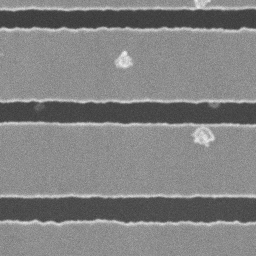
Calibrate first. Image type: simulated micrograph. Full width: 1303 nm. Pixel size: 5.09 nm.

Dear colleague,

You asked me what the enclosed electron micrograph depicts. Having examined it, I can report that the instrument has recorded lines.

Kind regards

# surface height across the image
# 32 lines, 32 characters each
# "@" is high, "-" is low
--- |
@@@@@@@@@@@@@@@@@@@@@@@@@@@@@@@@
--------------------------------
--------------------------------
----@---------@-----@-@@--------
@@@@@@@@@@@@@@@@@@@@@@@@@@@@@@@@
@@@@@@@@@@@@@@@@@@@@@@@@@@@@@@@@
@@@@@@@@@@@@@@@@@@@@@@@@@@@@@@@@
@@@@@@@@@@@@@@@@@@@@@@@@@@@@@@@@
@@@@@@@@@@@@@@@@@@@@@@@@@@@@@@@@
@@@@@@@@@@@@@@@@@@@@@@@@@@@@@@@@
@@@@@@@@@@@@@@@@@@@@@@@@@@@@@@@@
@@@@@@@@@@@@@@@@@@@@@@@@@@@@@@@@
@@@@@@@@@@@@@@@@@@@@@@@@@@@@@@@@
--------------------------------
--------------------------------
@@@@@@@@@@@@@@@-@@@@@--@---@@---
@@@@@@@@@@@@@@@@@@@@@@@@@@@@@@@@
@@@@@@@@@@@@@@@@@@@@@@@@@@@@@@@@
@@@@@@@@@@@@@@@@@@@@@@@@@@@@@@@@
@@@@@@@@@@@@@@@@@@@@@@@@@@@@@@@@
@@@@@@@@@@@@@@@@@@@@@@@@@@@@@@@@
@@@@@@@@@@@@@@@@@@@@@@@@@@@@@@@@
@@@@@@@@@@@@@@@@@@@@@@@@@@@@@@@@
@@@@@@@@@@@@@@@@@@@@@@@@@@@@@@@@
@@@@@@@@@@@@@@@@@@@@@@@@@@@@@@@@
--------------------------------
--------------------------------
------------@-------------------
@@@@@@@@@@@@@@@@@@@@@@@@@@@@@@@@
@@@@@@@@@@@@@@@@@@@@@@@@@@@@@@@@
@@@@@@@@@@@@@@@@@@@@@@@@@@@@@@@@
@@@@@@@@@@@@@@@@@@@@@@@@@@@@@@@@